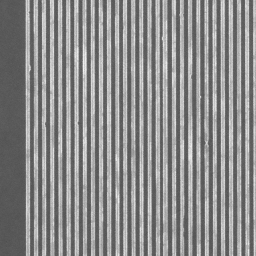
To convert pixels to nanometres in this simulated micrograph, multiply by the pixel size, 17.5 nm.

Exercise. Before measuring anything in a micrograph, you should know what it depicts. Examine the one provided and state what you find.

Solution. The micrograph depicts parallel lines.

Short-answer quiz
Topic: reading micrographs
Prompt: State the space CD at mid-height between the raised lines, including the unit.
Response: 0.0829 µm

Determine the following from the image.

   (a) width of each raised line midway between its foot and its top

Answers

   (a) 3.25 pixels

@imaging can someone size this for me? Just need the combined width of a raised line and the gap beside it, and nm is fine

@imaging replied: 142